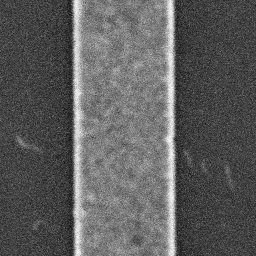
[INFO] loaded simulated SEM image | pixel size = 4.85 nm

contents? one or a few lines or trenches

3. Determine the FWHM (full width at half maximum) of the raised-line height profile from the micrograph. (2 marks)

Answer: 462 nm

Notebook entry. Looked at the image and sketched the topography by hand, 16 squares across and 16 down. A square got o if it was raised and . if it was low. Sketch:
.....oooooo.....
.....oooooo.....
.....oooooo.....
.....oooooo.....
.....oooooo.....
.....oooooo.....
.....oooooo.....
.....oooooo.....
.....oooooo.....
.....oooooo.....
.....oooooo.....
.....oooooo.....
.....oooooo.....
.....oooooo.....
.....oooooo.....
.....oooooo.....